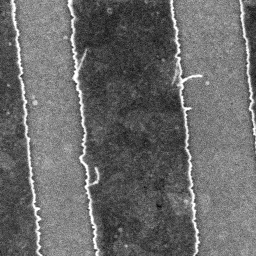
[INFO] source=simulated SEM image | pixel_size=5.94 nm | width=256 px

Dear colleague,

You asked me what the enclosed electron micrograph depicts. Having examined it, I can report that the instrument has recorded one or a few lines or trenches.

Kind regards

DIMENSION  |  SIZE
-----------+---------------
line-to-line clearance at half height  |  332 nm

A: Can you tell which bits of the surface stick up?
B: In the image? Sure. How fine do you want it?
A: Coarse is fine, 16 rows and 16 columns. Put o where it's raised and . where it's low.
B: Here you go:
o....oooooo....o
o....oooooo....o
o....oooooo....o
o....oooooo....o
o....oooooo....o
o....oooooo.....
oo...oooooo.....
oo...ooooooo....
oo...ooooooo....
oo...ooooooo....
oo...ooooooo....
oo...ooooooo....
oo....oooooo....
oo....oooooo....
oo....oooooo....
oo....oooooo....